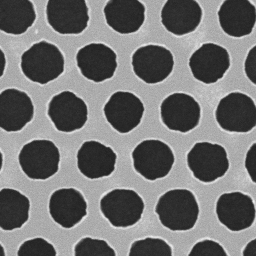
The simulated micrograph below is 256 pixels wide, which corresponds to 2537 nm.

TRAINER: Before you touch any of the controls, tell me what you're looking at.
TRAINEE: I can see a regular array of holes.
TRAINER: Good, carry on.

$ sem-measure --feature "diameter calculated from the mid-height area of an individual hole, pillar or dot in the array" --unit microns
0.395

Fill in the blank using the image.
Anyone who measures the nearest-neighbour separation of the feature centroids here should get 546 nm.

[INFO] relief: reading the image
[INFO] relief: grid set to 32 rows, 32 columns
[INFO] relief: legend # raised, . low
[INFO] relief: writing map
....##.....##.....###....###...#
....##.....##.....##.....##.....
....##.....##.....##.....##.....
....###....###...####....###....
#############################..#
####..####################.#####
###.....##....###....###....###.
.##.....##.....#......##.....##.
.##.....##.....##.....##.....##.
###....####...###....###....###.
################################
...#####.######.################
....###...####....###...####....
....##.....##.....##.....##.....
....##.....##.....##.....##.....
...####....###...####....##.....
########.######.##############.#
#####.############..############
###....###....###....###....###.
##.....###.....##.....#.....###.
##.....###....###.....##.....##.
###....###....###....###....###.
#########################..#####
########.#######################
...###....###....###....####...#
....##.....##.....##.....##.....
....##.....##.....##.....##.....
...####...####...###.....##.....
..###################...####...#
################################
###...####...####....####..####.
.#.....##.....##.....###....##..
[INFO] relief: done